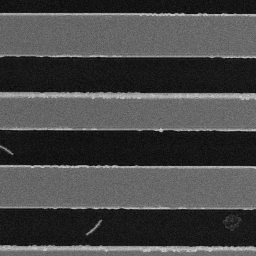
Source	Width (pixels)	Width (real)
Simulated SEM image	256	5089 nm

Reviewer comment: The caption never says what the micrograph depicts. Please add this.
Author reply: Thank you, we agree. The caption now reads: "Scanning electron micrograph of lines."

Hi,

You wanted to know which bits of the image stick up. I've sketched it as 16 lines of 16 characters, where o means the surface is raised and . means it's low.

................
oooooooooooooooo
oooooooooooooooo
oooooooooooooooo
................
................
oooooooooooooooo
oooooooooooooooo
................
................
oooooooooooooooo
oooooooooooooooo
oooooooooooooooo
................
................
oooooooooooooooo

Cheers